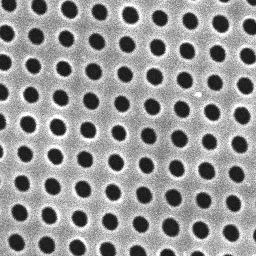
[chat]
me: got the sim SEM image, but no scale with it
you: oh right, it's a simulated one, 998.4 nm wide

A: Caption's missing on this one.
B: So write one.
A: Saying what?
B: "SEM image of a regular array of holes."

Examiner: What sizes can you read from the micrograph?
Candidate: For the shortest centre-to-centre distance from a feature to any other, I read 29.4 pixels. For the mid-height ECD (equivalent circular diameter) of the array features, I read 64.9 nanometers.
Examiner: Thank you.